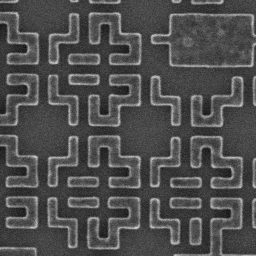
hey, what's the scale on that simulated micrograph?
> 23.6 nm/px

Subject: wiring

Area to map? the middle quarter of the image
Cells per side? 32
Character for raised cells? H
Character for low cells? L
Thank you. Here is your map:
LLLLLLLLLLLLLLLLLLLLLLLLLLLLLLLL
LLLLLLLLLLLLLLLLLLLLLLLLLLLLLLLL
LLLLLLLLLLLLLLLLLLLLLLLLLLLLLLLL
LHHHHHHHHLLLHHHHHHHLLLHHLLLLLLLL
LHHHHHHHHLLLHHHHHHHLLLHHLLLLLLLL
LLLLLLLLLLLLLLLLHHHLLLHHLLLLLLLL
LLLLLLLLLLLLLLLLHHHLLLHHLLLLLLLL
LLLLLLLLLLLLLLLLHHHLLLHHLLLLLLLL
HHHLLLHHHLLHHHHHHHHLLLHHHHHHHLLL
HHHLLLHHHLLHHHHHHHHLLLHHHHHHHLLL
LHHLLLHHHLLHHHHLLLLLLLLLLLLHHLLL
LHHLLLHHHLLHHHLLLLLLLLLLLLLHHLLL
LHHLLLHHHLLHHHLLLLLLLLLLLLLHHLLL
LHHLLLHHHHHHHHLLLLLLLLLLLLLHHLLL
LHHLLLHHHHHHHHLLLLLLLLLLLLLHHLLL
LLLLLLLLLLLLLLLLLLLLLLLLLLLLLLLL
LLLLLLLLLLLLLLLLLLLLLLLLLLLLLLLL
LLLLLLLLLLLLLLLLLLLLLLLLLLLLLLLL
LHHLLLHHHHHHHHLLLLLLLLLLLLLLLLLL
LHHLLLHHHHHHHHLLLLLLLLLLLLLHHLLL
LHHLLLHHHHHHHHLLLLLLLLLLLLLHHLLL
LHHLLLHHHLLHHHLLLLLLLLLLLLLHHLLL
LHHLLLHHHLLHHHLLLLLLLLLLLLLHHLLL
HHHLLLHHHLLHHHHHHHHLLLHHHHHHHLLL
HHHLLLHHHLLHHHHHHHHLLLHHHHHHHLLL
LLLLLLHHLLLLHHHHHHHLLLHHHHHHHLLL
LLLLLLLLLLLLLLLLHHHLLLHHLLLLLLLL
LLLLLLLLLLLLLLLLHHHLLLHHLLLLLLLL
LHHHHHHHLLLLHHHHHHHLLLHHLLLLLLLL
LHHHHHHHLLLHHHHHHHHLLLHHLLLHHHHH
LHHHHHHHLLLHHHHHHHHLLLHHLLLHHHHH
LLLLLLLLLLLLLLLLLLLLLLLLLLLLLLLL